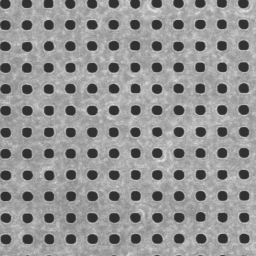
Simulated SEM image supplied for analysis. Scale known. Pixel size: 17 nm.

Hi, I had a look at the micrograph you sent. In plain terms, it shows a regular array of holes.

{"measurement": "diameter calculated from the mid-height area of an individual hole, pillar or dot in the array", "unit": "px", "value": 10.6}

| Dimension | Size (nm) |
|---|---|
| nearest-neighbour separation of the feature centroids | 361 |